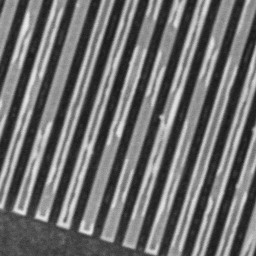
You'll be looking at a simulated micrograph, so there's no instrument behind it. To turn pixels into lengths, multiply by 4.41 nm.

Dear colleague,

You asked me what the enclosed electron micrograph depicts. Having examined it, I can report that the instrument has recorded parallel lines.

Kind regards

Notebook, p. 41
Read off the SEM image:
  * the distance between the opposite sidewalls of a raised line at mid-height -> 56.4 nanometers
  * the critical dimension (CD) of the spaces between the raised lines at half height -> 0.0448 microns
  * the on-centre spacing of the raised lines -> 101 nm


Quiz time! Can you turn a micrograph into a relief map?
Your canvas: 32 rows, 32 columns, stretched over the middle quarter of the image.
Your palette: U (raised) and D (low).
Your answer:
UUDDUUUUDDUUUUDDUUUUDDUUUUDDUUUD
UDDDUUUDDDUUUDDDUUUDDDUUUDDDUUUD
UDDDUUUDDDUUUDDDUUUDDDUUUDDDUUUD
UDDUUUUDDUUUUDDUUUUDDUUUUDDUUUUD
DDDUUUDDDUUUDDDUUUDDDUUUDDDUUUDD
DDDUUUDDDUUUDDDUUUDDDUUUDDDUUUDD
DDDUUUDDDUUUDDDUUUDDDUUUDDDUUUDD
DDUUUUDDUUUUDDUUUUDDUUUDDDUUUUDD
DDUUUDDDUUUDDDUUUDDDUUUDDDUUUDDD
DDUUUDDDUUUDDDUUUDDDUUUDDDUUUDDD
DUUUUDDUUUUDDUUUUDDUUUDDDUUUUDDU
DUUUDDDUUUDDDUUUDDDUUUDDDUUUDDDU
DUUUDDDUUUDDDUUUDDDUUUDDDUUUDDDU
UUUUDDUUUUDDUUUUDDUUUUDDUUUUDDUU
UUUDDDUUUDDDUUUDDDUUUDDDUUUDDDUU
UUUDDDUUUDDDUUUDDDUUUDDDUUUDDDUU
UUUDDUUUUDDUUUUDDUUUUDDDUUUDDUUU
UUDDDUUUDDDUUUDDDUUUDDDUUUDDDUUU
UUDDDUUUDDDUUUDDDUUUDDDUUUDDDUUU
UUDDDUUUDDDUUUDDDUUUDDDUUUDDDUUU
UUDDUUUUDDUUUUDDUUUUDDUUUDDDUUUU
UDDDUUUDDDUUUDDDUUUDDDUUUDDDUUUD
UDDDUUUDDDUUUDDDUUUDDDUUUDDDUUUD
UDDDUUUDDUUUUDDUUUUDDUUUUDDUUUUD
DDDUUUDDDUUUDDDUUUDDDUUUDDDUUUDD
DDDUUUDDDUUUDDDUUUDDDUUUDDDUUUDD
DDDUUUDDUUUUDDUUUUDDUUUUDDUUUUDD
DDUUUDDDUUUDDDUUUDDDUUUDDDUUUDDD
DDUUUDDDUUUDDDUUUDDDUUUDDDUUUDDD
DUUUUDDUUUUDDUUUUDDUUUUDDDUUUDDU
DUUUDDDUUUDDDUUUDDDUUUDDDUUUDDDU
DUUUDDDUUUDDDUUUDDDUUUDDDUUUDDDU